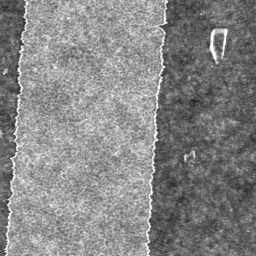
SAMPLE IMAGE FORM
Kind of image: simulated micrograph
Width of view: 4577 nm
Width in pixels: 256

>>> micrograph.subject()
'one or a few lines or trenches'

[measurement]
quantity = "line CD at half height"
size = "2490 nm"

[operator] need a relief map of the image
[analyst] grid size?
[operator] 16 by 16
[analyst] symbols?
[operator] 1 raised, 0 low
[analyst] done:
0011111111000000
0011111111000000
0111111111000100
0111111111000100
0111111111000000
0111111111000000
0111111111000000
0111111111000000
0111111111000000
0111111111000000
0111111111000000
0111111110000000
0111111110000000
0111111110000000
1111111110000000
1111111110000000